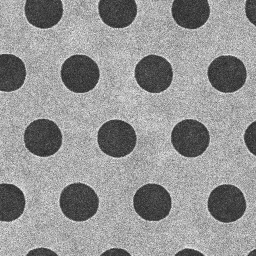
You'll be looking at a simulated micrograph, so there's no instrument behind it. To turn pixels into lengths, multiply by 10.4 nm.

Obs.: a regular array of holes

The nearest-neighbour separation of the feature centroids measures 764 nm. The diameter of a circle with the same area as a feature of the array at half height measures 403 nanometres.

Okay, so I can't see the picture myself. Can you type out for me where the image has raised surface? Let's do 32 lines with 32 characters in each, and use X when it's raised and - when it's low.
XXX-----XXXX-----XXXXX----XXXXX-
XXX-----XXXX-----XXXX-----XXXXX-
XXXX----XXXXX----XXXXX----XXXXX-
XXXXX-XXXXXXXX-XXXXXXXX--XXXXXXX
XXXXXXXXXXXXXXXXXXXXXXXXXXXXXXXX
XXXXXXXXXXXXXXXXXXXXXXXXXXXXXXXX
XXXXXXXXXXXXXXXXXXXXXXXXXXXXXXXX
---XXXXX----XXXXXX---XXXXXX---XX
---XXXXX----XXXXX----XXXXX-----X
---XXXXX----XXXXX-----XXXX-----X
---XXXXX----XXXXX----XXXXX-----X
XXXXXXXXX--XXXXXXXX-XXXXXXXX-XXX
XXXXXXXXXXXXXXXXXXXXXXXXXXXXXXXX
XXXXXXXXXXXXXXXXXXXXXXXXXXXXXXXX
XXXXXXXXXXXXXXXXXXXXXXXXXXXXXXXX
XXXX---XXXXXX---XXXXXX---XXXXXX-
XXX-----XXXX-----XXXX-----XXXXX-
XXX-----XXXX-----XXXX-----XXXXX-
XXX----XXXXXX----XXXXX----XXXXX-
XXXXX-XXXXXXXX--XXXXXXX--XXXXXXX
XXXXXXXXXXXXXXXXXXXXXXXXXXXXXXXX
XXXXXXXXXXXXXXXXXXXXXXXXXXXXXXXX
XXXXXXXXXXXXXXXXXXXXXXXXXXXXXXXX
--XXXXXX---XXXXXX----XXXXXX---XX
---XXXXX----XXXXX----XXXXX----XX
---XXXX-----XXXXX----XXXXX-----X
---XXXXX----XXXXX----XXXXX-----X
--XXXXXXX--XXXXXXX--XXXXXXX---XX
XXXXXXXXXXXXXXXXXXXXXXXXXXXXXXXX
XXXXXXXXXXXXXXXXXXXXXXXXXXXXXXXX
XXXXXXXXXXXXXXXXXXXXXXXXXXXXXXXX
XXXX---XXXXXX---XXXXXX---XXXXXX-